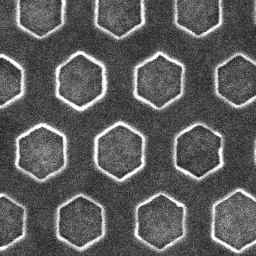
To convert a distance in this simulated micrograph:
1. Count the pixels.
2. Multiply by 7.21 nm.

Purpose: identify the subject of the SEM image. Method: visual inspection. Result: holes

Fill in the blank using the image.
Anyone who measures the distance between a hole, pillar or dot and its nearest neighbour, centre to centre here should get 0.566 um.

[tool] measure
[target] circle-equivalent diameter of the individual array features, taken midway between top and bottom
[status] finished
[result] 347 nanometres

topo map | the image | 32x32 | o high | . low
oo......oooo......oooo.....ooooo
oo......oooo......oooo.....ooooo
oo......oooo......oooo.....ooooo
ooo....oooooo....oooooo....ooooo
oooooooooooooooooooooooooooooooo
oooooooooooooooooooooooooooooooo
oooooooooooooooooooooooooooooooo
.oooooooo..oooooooo..oooooooo..o
..oooooo.....oooo......oooo.....
...oooo......oooo......oooo.....
...oooo......oooo......oooo.....
...oooo......oooo......oooo.....
.ooooooo....oooooo....oooooo...o
oooooooooooooooooooooooooooooooo
oooooooooooooooooooooooooooooooo
oooooooooooooooooooooooooooooooo
oooo...oooooo....oooooo....ooooo
oo......oooo......oooo......oooo
oo......oooo......oooo.....ooooo
oo......oooo......oooo.....ooooo
oo......oooo......oooo.....ooooo
ooo....oooooo....oooooo...oooooo
oooooooooooooooooooooooooooooooo
oooooooooooooooooooooooooooooooo
oooooooooooooooooooo.oooooooo..o
..oooooo....oooooo....ooooo.....
...oooo......oooo......oooo.....
...oooo......oooo......oooo.....
...oooo......oooo......oooo.....
...ooooo.....oooo......oooo.....
.oooooooo..oooooooo..ooooooo...o
oooooooooooooooooooooooooooooooo